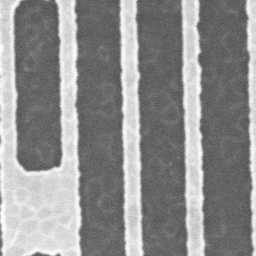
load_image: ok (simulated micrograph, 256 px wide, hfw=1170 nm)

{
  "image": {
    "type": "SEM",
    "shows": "one or a few lines or trenches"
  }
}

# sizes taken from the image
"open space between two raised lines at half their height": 220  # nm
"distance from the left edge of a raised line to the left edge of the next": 281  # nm